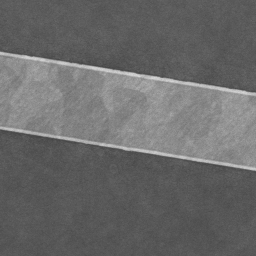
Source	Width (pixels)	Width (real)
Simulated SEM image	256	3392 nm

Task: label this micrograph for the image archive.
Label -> one or a few lines or trenches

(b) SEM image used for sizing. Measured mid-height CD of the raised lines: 992 nanometers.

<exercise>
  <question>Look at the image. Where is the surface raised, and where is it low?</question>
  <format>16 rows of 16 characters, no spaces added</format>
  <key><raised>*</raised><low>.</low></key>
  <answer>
................
................
................
*...............
*******.........
**************..
****************
****************
...*************
.........*******
...............*
................
................
................
................
................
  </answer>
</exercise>